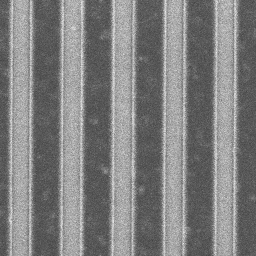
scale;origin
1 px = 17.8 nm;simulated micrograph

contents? parallel lines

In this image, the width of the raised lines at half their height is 33.3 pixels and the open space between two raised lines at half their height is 0.327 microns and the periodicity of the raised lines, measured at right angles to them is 911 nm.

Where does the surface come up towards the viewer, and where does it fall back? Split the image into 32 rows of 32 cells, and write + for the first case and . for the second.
++..++++..++++...++++..++++..+++
++..++++..++++...++++..++++..+++
++..++++..++++...++++..++++..+++
++..++++..++++...++++..++++..+++
++..++++..++++...++++..++++..+++
++..++++..++++...++++..++++..+++
++..++++..++++...++++..++++..+++
+...++++..++++...++++..++++..+++
+...++++..++++...++++..++++..+++
++..++++..++++...++++..++++..+++
++..++++..++++...++++..++++..+++
++..++++..++++...++++..++++..+++
++..++++..++++...++++..++++..+++
++..++++..++++...++++..++++..+++
+...++++..++++...++++..++++..+++
+...++++..++++...++++..++++..+++
+...++++..++++...++++..++++..+++
+...++++..++++...++++..++++..+++
+...++++..++++...++++..++++..+++
+...++++..++++...++++..++++..+++
+...++++..++++...++++..++++..+++
+...++++..++++...++++..++++..+++
+...++++..++++...++++..++++..+++
+...++++..++++...++++..++++..+++
+...++++..++++...++++..++++..+++
+...++++..++++...++++..++++..+++
+...++++..++++...++++..++++..+++
+...++++..++++...++++..++++..+++
+...++++..++++...++++..++++..+++
+...++++..++++...++++..++++..+++
+...++++..++++...++++..++++..+++
+...++++..++++...++++..++++..+++